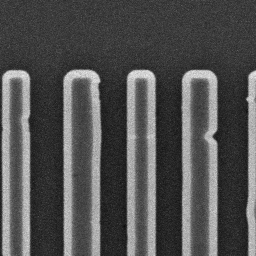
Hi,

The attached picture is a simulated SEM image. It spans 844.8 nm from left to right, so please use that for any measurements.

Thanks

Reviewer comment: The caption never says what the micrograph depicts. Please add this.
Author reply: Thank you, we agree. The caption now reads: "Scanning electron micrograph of one or a few lines or trenches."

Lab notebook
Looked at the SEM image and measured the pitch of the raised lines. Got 202 nm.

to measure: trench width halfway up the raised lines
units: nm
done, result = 123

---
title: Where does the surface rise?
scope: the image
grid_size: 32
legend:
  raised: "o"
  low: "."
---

................................
................................
................................
................................
................................
................................
................................
................................
................................
.oo......ooo.....oo.....oo......
.oo.....oooo....ooo....oooo....o
.oo.....oooo....ooo....oooo....o
.oo.....oooo....ooo....oooo....o
.oo.....oooo....ooo....oooo.....
.oo.....oooo....ooo....oooo....o
.oo.....oooo....ooo....oooo....o
.oo.....oooo....ooo....ooo.....o
.oo.....oooo....ooo....ooo......
.oo.....oooo....ooo....oooo.....
.oo.....oooo....ooo....oooo....o
.oo.....oooo....ooo....oooo....o
.oo.....oooo....ooo....oooo....o
.oo.....oooo....ooo....oooo....o
.oo.....oooo....ooo....oooo....o
.oo.....oooo....ooo....oooo....o
.oo.....oooo....ooo....oooo....o
.oo.....oooo....ooo....oooo....o
.oo.....oooo....ooo....oooo....o
.oo.....oooo....ooo....oooo....o
.oo.....oooo....ooo....oooo....o
.oo.....oooo....ooo....oooo....o
.oo.....oooo....ooo....oooo....o